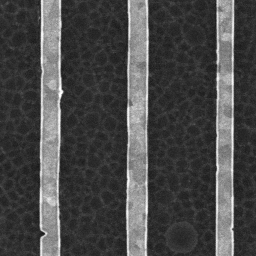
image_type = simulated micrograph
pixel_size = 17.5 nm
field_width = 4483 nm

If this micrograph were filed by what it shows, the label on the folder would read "one or a few lines or trenches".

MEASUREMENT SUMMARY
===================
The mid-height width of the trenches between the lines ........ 1210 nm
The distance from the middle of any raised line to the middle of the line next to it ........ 87.2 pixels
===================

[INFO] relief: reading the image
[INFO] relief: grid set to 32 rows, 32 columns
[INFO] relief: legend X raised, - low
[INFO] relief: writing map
-----XX---------XX---------XX---
-----XX---------XX---------XX---
-----XX---------XX---------XX---
-----XX---------XX---------XX---
-----XX---------XX---------XX---
-----XX---------XX---------XX---
-----XX---------XX---------XX---
-----XX---------XX---------XX---
-----XX---------XX---------XX---
-----XXX--------XX---------XX---
-----XXX--------XX---------XX---
-----XXX--------XX---------XX---
-----XX---------XX---------XX---
-----XX---------XX---------XX---
-----XX---------XX---------XX---
-----XX---------XX---------XX---
-----XX---------XX---------XX---
-----XX---------XX---------XX---
-----XX---------XX---------XX---
-----XX---------XX---------XX---
-----XX---------XX---------XX---
-----XX---------XX---------XX---
-----XX---------XX---------XX---
-----XX---------XX---------XX---
-----XX---------XX---------XX---
-----XX---------XX---------XX---
-----XX---------XX---------XX---
-----XX---------XX---------XX---
-----XX---------XX---------XX---
-----XX---------XX---------XX---
-----XX---------XX---------XX---
-----XX---------XX---------XX---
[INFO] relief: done